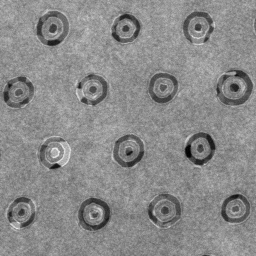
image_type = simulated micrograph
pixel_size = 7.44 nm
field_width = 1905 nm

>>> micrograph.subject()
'a regular array of ring-shaped raised bodies with a dot in the middle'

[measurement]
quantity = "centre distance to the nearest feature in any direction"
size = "0.513 µm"